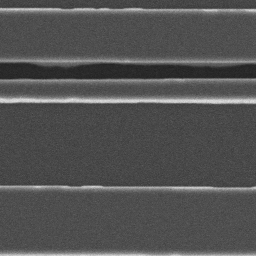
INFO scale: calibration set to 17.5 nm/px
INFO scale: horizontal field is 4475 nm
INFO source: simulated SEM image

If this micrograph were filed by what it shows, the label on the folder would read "lines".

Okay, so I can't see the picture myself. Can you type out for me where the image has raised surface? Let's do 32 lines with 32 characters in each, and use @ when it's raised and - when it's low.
--------------------------------
@@@@@@@@@@@@@@@@@@@@@@@@@@@@@@@@
@@@@@@@@@@@@@@@@@@@@@@@@@@@@@@@@
@@@@@@@@@@@@@@@@@@@@@@@@@@@@@@@@
@@@@@@@@@@@@@@@@@@@@@@@@@@@@@@@@
@@@@@@@@@@@@@@@@@@@@@@@@@@@@@@@@
@@@@@@@@@@@@@@@@@@@@@@@@@@@@@@@@
@@@@@@@@@@@@@@@@@@@@@@@@@@@@@@@@
--------------------------------
--------------------------------
@@@@@@@@@@@@@@@@@@@@@@@@@@@@@@@@
@@@@@@@@@@@@@@@@@@@@@@@@@@@@@@@@
@@--@@@@@-@@@@@@@@@@@@@@@@@@@@@@
--------------------------------
--------------------------------
--------------------------------
--------------------------------
--------------------------------
--------------------------------
--------------------------------
--------------------------------
--------------------------------
--------------------------------
@@@@@@@@@@@@@@@@@@@@@@@@@@------
@@@@@@@@@@@@@@@@@@@@@@@@@@@@@@@@
@@@@@@@@@@@@@@@@@@@@@@@@@@@@@@@@
@@@@@@@@@@@@@@@@@@@@@@@@@@@@@@@@
@@@@@@@@@@@@@@@@@@@@@@@@@@@@@@@@
@@@@@@@@@@@@@@@@@@@@@@@@@@@@@@@@
@@@@@@@@@@@@@@@@@@@@@@@@@@@@@@@@
@@@@@@@@@@@@@@@@@@@@@@@@@@@@@@@@
@@@@@@@@@@@@@@@@@@@@@@@@@@@@@@@@